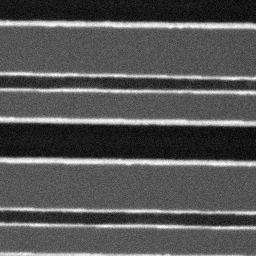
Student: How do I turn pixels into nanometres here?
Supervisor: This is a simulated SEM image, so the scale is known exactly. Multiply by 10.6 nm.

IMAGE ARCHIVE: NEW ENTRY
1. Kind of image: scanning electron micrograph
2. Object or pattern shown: lines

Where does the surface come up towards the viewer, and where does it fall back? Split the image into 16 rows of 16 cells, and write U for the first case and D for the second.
DDDDDDDDDDDDDDDD
DDDDDDDDDDDDDDDD
UUUUUUUUUUUUUUUU
UUUUUUUUUUUUUUUU
UUUUUUUUUUUUUUUU
UUUUUUUUUUUUUUUU
UUUUUUUUUUUUUUUU
DDDUUUUUUUUUUUUU
DDDDDDDDDDDDDDDD
DDDDDDDDDDDDDDDD
UUUUUUUUUUUUUUUU
UUUUUUUUUUUUUUUU
UUUUUUUUUUUUUUUU
UUUUUUUUUUUUUUUU
UUUUUUUUUUUUUUUU
UUUUUUUUUUUUUUUU